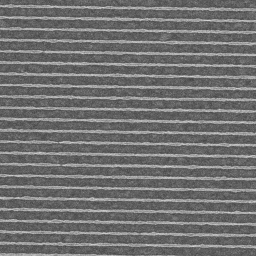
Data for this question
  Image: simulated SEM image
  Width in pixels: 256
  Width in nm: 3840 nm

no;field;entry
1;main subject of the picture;parallel lines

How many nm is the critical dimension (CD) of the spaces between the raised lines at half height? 139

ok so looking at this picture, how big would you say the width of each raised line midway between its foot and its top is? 2 pixels